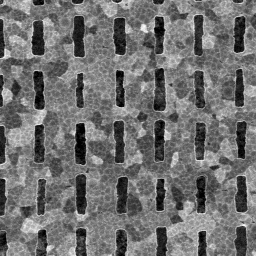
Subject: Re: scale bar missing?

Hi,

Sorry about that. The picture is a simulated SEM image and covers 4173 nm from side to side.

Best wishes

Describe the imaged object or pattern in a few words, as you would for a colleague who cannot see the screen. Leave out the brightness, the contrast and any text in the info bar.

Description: a regular array of holes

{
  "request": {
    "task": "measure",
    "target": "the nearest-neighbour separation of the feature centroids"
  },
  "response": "653 nm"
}